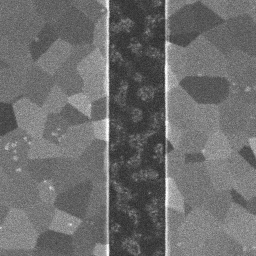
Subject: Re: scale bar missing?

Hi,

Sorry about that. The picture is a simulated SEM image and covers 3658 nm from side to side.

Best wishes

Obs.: one or a few lines or trenches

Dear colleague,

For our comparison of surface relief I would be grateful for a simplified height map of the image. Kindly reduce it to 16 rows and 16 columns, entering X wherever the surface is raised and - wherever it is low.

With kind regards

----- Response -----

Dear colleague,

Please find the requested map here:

XXXXXXX---XXXXXX
XXXXXXX---XXXXXX
XXXXXXX---XXXXXX
XXXXXXX---XXXXXX
XXXXXXX---XXXXXX
XXXXXXX---XXXXXX
XXXXXXX---XXXXXX
XXXXXXX---XXXXXX
XXXXXXX---XXXXXX
XXXXXXX---XXXXXX
XXXXXXX---XXXXXX
XXXXXXX---XXXXXX
XXXXXXX---XXXXXX
XXXXXXX---XXXXXX
XXXXXXX---XXXXXX
XXXXXXX---XXXXXX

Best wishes